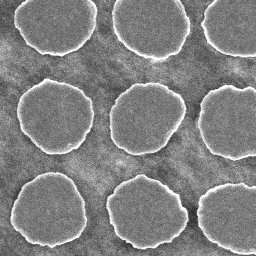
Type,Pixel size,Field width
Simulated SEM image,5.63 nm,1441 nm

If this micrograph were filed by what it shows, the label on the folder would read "raised bodies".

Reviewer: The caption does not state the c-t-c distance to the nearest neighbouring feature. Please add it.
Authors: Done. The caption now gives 520 nanometres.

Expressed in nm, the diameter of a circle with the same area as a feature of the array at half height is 414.